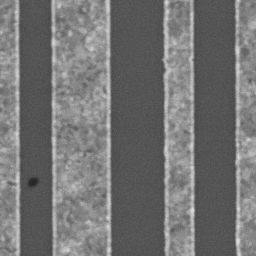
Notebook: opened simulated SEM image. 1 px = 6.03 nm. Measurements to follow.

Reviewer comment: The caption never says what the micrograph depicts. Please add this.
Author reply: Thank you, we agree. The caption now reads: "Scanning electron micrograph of one or a few lines or trenches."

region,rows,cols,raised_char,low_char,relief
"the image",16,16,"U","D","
UDDUUUUDDDUUDDDU
UDDUUUUDDDUUDDDU
UDDUUUUDDDUUDDDU
UDDUUUUDDDUUDDDU
UDDUUUUDDDUUDDDU
UDDUUUUDDDUUDDDU
UDDUUUUDDDUUDDDU
UDDUUUUDDDUUDDDU
UDDUUUUDDDUUDDDU
UDDUUUUDDDUUDDDU
UDDUUUUDDDUUDDDU
UDDUUUUDDDUUDDDU
UDDUUUUDDDUUDDDU
UDDUUUUDDDUUDDDU
UDDUUUUDDDUUDDDU
UDDUUUUDDDUUDDDU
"